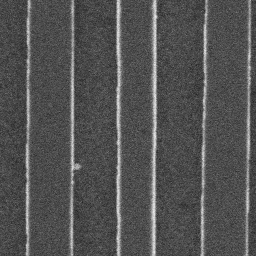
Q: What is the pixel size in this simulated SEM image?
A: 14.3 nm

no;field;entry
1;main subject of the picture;lines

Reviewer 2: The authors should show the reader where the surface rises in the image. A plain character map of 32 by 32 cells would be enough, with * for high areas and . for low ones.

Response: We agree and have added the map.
....*****......****.......*****.
....*****......****.......*****.
...******......****.......*****.
...******......****.......*****.
...******......****.......*****.
...******......****.......*****.
....*****......****.......*****.
...******......****.......*****.
...******......****.......*****.
...******......****.......*****.
...******......****.......*****.
...******......****.......*****.
...******......****......******.
...******......****.......*****.
...******......****......******.
...******......****......******.
...******......****......******.
...******......****......******.
...******......****......******.
...******......****......******.
...******......****......******.
...******......****......******.
...******......****......******.
...******......****......******.
...******......****......******.
...******......****......******.
...******......****......******.
...******......****......******.
...******......****......******.
...******......****......******.
...******......****......******.
...******......****......******.